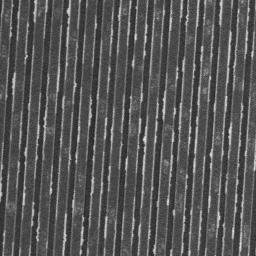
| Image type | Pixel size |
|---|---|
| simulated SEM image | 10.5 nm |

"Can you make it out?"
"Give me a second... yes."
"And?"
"parallel lines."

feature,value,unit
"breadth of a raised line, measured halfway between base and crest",0.116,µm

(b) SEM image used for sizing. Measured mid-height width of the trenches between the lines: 6.36 px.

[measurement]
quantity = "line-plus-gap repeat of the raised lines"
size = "16.9 px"